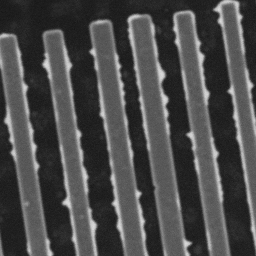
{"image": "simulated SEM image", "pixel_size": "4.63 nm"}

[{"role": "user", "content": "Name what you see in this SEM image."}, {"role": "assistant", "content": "parallel lines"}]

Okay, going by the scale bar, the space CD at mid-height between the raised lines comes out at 107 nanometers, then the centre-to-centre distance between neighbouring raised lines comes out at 206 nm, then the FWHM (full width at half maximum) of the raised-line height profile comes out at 107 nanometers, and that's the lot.